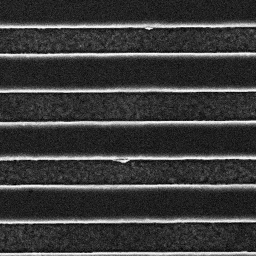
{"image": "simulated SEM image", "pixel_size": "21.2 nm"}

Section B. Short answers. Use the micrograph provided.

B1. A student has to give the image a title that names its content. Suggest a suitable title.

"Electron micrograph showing lines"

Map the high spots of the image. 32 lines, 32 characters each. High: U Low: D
UUUUUUUUUUUUUUUUUUUUUUUUUUUUUUUU
UUUUUUUUUUUUUUUUUUUUUUUUUUUUUUUU
UUUUUUUUUUUUUUUUUUUUUUUUUUUUUUUU
DDDDDDDDDDDDDDDDDDDDDDDDDDDDDDDD
DDDDDDDDDDDDDDDDDDDDDDDDDDDDDDDD
DDDDDDDDDDDDDDDDDDDDDDDDDDDDDDDD
DDDDDDDDDDDDDDDDDDDDDDDDDDDDDDDD
UUUUUUUUUUUUUUUUUUUUUUUUUUUUUUUU
UUUUUUUUUUUUUUUUUUUUUUUUUUUUUUUU
UUUUUUUUUUUUUUUUUUUUUUUUUUUUUUUU
UUUUUUUUUUUUUUUUUUUUUUUUUUUUUUUU
DDDDDDDDDDDDDDDDDDDDDDDDDDDDDDDD
DDDDDDDDDDDDDDDDDDDDDDDDDDDDDDDD
DDDDDDDDDDDDDDDDDDDDDDDDDDDDDDDD
DDDDDDDDDDDDDDDDDDDDDDDDDDDDDDDD
UUUUUUUUUUUUUUUUUUUUUUUUUUUUUUUU
UUUUUUUUUUUUUUUUUUUUUUUUUUUUUUUU
UUUUUUUUUUUUUUUUUUUUUUUUUUUUUUUU
UUUUUUUUUUUUUUUUUUUUUUUUUUUUUUUU
UUUUUUUUUUUUUUUUUUUUUUUUUUUUUUUU
DDDDDDDDDDDDDDDDDDDDDDDDDDDDDDDD
DDDDDDDDDDDDDDDDDDDDDDDDDDDDDDDD
DDDDDDDDDDDDDDDDDDDDDDDDDDDDDDDD
UUUUUUUUUUUUUUUUUUUUUUUUUUUUUUUU
UUUUUUUUUUUUUUUUUUUUUUUUUUUUUUUU
UUUUUUUUUUUUUUUUUUUUUUUUUUUUUUUU
UUUUUUUUUUUUUUUUUUUUUUUUUUUUUUUU
UUUUUUUUUUUUUUUUUUUUUUUUUUUUUUUU
DDDDDDDDDDDDDDDDDDDDDDDDDDDDDDDD
DDDDDDDDDDDDDDDDDDDDDDDDDDDDDDDD
DDDDDDDDDDDDDDDDDDDDDDDDDDDDDDDD
DDDDDDDDDDDDDDDDDDDDDDDDDDDDDDDD